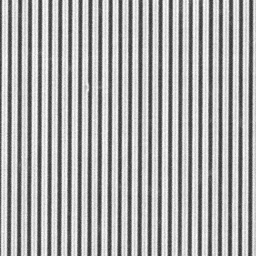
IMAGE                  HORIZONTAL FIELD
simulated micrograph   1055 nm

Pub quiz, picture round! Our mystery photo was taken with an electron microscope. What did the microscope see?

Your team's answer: parallel lines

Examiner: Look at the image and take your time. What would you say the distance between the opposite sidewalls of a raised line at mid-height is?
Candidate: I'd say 21.1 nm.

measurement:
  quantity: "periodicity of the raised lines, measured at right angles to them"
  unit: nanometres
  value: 41.4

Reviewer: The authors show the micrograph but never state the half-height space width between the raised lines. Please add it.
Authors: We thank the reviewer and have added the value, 21.1 nm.